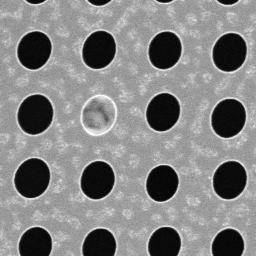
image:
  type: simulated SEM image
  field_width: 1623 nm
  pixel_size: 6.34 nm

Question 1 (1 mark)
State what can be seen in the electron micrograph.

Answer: a regular array of holes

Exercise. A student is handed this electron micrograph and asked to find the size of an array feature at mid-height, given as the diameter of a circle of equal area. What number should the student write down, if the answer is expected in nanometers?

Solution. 227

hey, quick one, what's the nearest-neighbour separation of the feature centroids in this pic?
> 403 nm